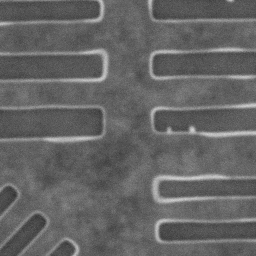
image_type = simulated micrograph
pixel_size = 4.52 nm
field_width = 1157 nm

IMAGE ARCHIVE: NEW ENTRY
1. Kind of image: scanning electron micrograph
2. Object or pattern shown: groups of lines, slits or small figures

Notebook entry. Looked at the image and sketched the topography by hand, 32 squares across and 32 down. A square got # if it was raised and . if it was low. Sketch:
.............######.............
.............######.............
............#######.............
################################
################################
################################
####################............
.............######.............
.............######.............
.............######.............
################################
################################
################################
####........###############.....
.............######.............
.............######.............
.............#######............
################################
################################
################################
################################
################################
####################............
..#################.............
..##################............
..##############################
.###############################
###...##########################
##....##############............
##...###############............
#...###..#######################
...###....######################